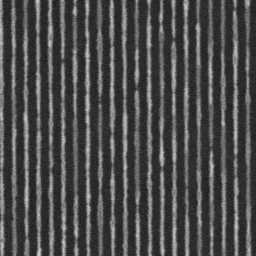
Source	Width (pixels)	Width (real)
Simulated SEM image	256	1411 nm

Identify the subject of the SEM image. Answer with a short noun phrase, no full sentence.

parallel lines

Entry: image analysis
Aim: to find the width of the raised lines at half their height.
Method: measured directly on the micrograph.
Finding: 0.0151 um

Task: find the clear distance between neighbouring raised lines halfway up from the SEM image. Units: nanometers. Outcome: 50.9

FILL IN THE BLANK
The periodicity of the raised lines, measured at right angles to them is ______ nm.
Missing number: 67.8